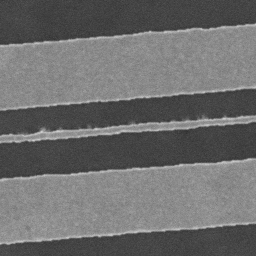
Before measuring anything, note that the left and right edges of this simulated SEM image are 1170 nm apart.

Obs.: lines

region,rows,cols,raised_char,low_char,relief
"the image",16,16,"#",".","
................
................
....############
################
################
################
#####...........
................
...##...........
................
.........#######
################
################
################
#########.......
................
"